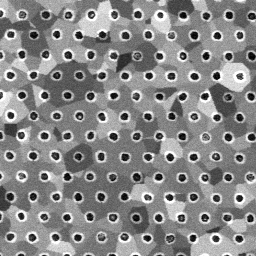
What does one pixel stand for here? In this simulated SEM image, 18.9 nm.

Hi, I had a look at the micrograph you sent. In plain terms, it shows a regular array of holes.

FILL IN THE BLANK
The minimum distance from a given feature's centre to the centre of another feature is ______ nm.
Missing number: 427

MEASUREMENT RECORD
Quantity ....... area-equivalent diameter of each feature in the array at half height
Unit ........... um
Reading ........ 0.164